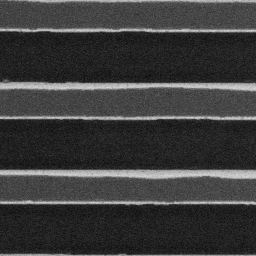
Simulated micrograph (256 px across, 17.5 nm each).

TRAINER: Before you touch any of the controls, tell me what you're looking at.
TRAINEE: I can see lines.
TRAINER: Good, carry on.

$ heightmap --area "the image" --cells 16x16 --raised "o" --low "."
oooooooooooooooo
oooooooooooooooo
................
................
................
oooooooooooooooo
oooooooooooooooo
................
................
................
................
oooooooooooooooo
oooooooooooooooo
................
................
................